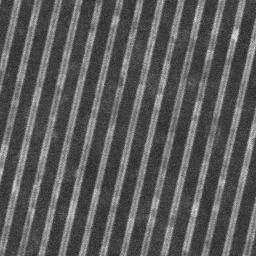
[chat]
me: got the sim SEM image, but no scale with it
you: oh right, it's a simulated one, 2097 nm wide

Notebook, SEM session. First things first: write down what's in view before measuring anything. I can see parallel lines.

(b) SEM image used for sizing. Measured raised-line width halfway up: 0.0439 µm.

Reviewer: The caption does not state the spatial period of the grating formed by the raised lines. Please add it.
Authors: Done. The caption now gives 163 nanometres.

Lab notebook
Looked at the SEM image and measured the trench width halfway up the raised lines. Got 125 nanometres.